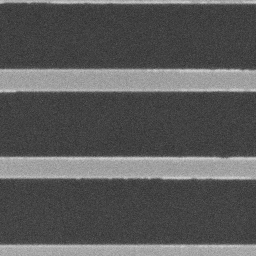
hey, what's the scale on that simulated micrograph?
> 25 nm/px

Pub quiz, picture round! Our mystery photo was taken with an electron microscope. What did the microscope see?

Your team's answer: lines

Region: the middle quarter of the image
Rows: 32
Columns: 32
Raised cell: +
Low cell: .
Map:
................................
................................
++++++++++++++++++++++++++++++++
++++++++++++++++++++++++++++++++
++++++++++++++++++++++++++++++++
++++++++++++++++++++++++++++++++
++++++++++++++++++++++++++++++++
................................
................................
................................
................................
................................
................................
................................
................................
................................
................................
................................
................................
................................
................................
................................
................................
++++++++++++++++++++++++++++++++
++++++++++++++++++++++++++++++++
++++++++++++++++++++++++++++++++
++++++++++++++++++++++++++++++++
++++++++++++++++++++++++++++++++
...+.......+...+.....+..++++++++
................................
................................
................................